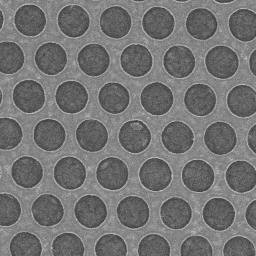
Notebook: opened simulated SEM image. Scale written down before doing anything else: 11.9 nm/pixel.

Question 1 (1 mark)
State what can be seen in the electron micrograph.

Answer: a regular array of holes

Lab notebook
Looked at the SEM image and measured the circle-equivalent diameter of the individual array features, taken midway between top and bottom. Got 391 nm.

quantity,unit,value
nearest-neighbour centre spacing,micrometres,0.509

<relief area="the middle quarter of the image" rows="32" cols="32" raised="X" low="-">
XXXX-------XXX--------XXX-------
XXXX-------XXXX-------XXXX------
XXXXX-----XXXXXX-----XXXXX------
XXXXXXXXXXXXXXXXXXXXXXXXXXXXX-XX
----XXXXXXXXXXXXXXXXXXXXXXXXXXXX
-----XXXXX-----XXXXX------XXXXXX
------XXX-------XXXX-------XXXX-
------XXX-------XXX--------XXX--
------XXX-------XXX--------XXX--
------XXX-------XXX--------XXX--
-----XXXX-------XXXX-------XXX--
----XXXXXX-----XXXXX------XXXXX-
X-XXXXXXXXXX-XXXXXXXX----XXXXXXX
XXXXXXXXXXXXXXXXXXXXXXXXXXXXXXXX
XXXX-----XXXXXXX----XXXXXXX---XX
XXX-------XXXXX------XXXX------X
XXX--------XXX-------XXXX-------
XXX--------XXX--------XX--------
XXX--------XXX--------XX--------
XXX--------XXX-------XXX--------
XXXX------XXXX-------XXXX-------
XXXXX----XXXXXX-----XXXXXX-----X
XXXXXXXXXXXXXXXXXXXXXXXXXXXX-XXX
---XXXXXXX---XXXXXXXXX--XXXXXXXX
----XXXXX------XXXXX-----XXXXXX-
-----XXX--------XXX-------XXXX--
-----XXX--------XXX--------XXX--
------XX--------XXX--------XX---
------XX--------XXX--------XX---
-----XXXX-------XXX--------XXX--
----XXXXX------XXXXX------XXXX--
X-XXXXXXXXX--XXXXXXXX----XXXXXX-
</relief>